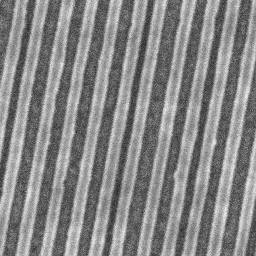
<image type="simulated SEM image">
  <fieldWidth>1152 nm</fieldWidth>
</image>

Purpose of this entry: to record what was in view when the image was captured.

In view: parallel lines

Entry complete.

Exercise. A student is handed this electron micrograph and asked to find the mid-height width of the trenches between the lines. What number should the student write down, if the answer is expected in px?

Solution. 13.4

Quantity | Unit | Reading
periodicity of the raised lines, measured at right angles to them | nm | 106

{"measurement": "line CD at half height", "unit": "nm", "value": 47.6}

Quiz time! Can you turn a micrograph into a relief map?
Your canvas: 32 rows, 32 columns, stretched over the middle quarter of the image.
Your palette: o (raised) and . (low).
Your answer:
...oo....oo....ooo..ooo....ooo..
..ooo....oo....ooo..ooo....ooo..
..ooo....oo....oo...oo.....oo...
..ooo...ooo....oo..ooo....ooo...
..oo....ooo....oo..ooo....ooo...
..oo....ooo...ooo..ooo....ooo...
..oo....oo....ooo..ooo....oo....
..oo....oo....ooo..oo.....oo....
.ooo...ooo....oo...oo.....oo....
.oo....ooo...ooo...oo....ooo...o
.oo....ooo...ooo..ooo....ooo...o
.oo....oo....ooo..ooo....ooo...o
.oo....oo....ooo..ooo....ooo...o
ooo....oo....oo...oo.....oo....o
ooo...ooo...ooo...oo....ooo....o
oo....ooo...ooo..ooo....ooo...oo
oo....ooo...ooo..ooo....ooo...oo
oo....oo....ooo..ooo....ooo...oo
oo....oo....oo...oo.....ooo...oo
oo...ooo....oo...oo.....oo....oo
oo...ooo...ooo...oo.....oo...ooo
o....ooo...ooo..ooo....ooo...ooo
o....oo....ooo..ooo....ooo...ooo
o....oo....ooo..ooo....ooo...ooo
o....oo....oo...oo.....oo....oo.
o...ooo...ooo...oo....ooo....oo.
o...ooo...ooo..ooo....ooo...ooo.
....ooo...ooo..ooo....ooo...ooo.
....ooo...ooo..ooo....ooo...ooo.
....oo....ooo..oo.....ooo...oo..
...ooo....oo...oo.....oo....oo..
...ooo...ooo...oo....ooo....oo..